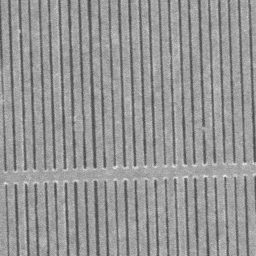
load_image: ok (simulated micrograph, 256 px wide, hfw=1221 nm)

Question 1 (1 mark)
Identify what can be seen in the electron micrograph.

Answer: parallel lines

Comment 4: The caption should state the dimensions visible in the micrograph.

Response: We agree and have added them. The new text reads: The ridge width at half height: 35.7 nm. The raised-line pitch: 0.0476 micrometres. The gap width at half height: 13.7 nm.